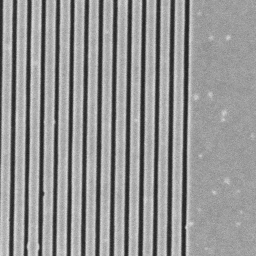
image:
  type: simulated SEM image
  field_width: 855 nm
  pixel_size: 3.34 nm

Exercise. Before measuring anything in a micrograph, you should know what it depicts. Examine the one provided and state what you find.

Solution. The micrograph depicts parallel lines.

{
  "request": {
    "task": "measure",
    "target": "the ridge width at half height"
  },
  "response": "30.4 nanometers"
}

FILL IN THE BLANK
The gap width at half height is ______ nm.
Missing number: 15.4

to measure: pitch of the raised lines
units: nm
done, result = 47.8